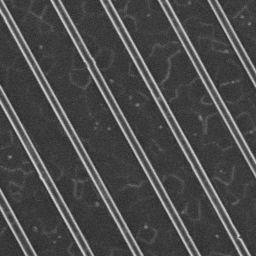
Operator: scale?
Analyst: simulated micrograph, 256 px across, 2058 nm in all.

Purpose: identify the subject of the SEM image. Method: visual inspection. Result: parallel lines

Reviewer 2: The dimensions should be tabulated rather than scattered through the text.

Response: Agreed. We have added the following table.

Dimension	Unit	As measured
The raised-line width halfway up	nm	58.1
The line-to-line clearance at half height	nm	296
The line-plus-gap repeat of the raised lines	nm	376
